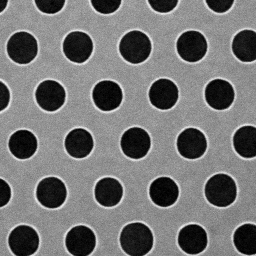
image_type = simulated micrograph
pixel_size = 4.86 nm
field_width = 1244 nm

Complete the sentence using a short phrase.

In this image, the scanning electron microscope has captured a regular array of holes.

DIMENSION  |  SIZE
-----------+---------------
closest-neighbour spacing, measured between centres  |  55.2 px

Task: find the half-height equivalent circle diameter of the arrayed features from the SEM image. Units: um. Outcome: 0.151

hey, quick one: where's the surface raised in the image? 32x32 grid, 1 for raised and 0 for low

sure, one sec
01110000111000011110001111000111
11111001111100111111011111101111
11111111111111111111111111111111
11111111111111111111111111111111
11001111000111110011110001111000
10000111000011100001110000111000
10000111000111100001110000111000
11001111100111110011111001111100
11111111111111111111111111111111
11111111111111111111111111111111
11111000111100011110001111000111
01110000111100011110001111000111
01110000111100011110001111000111
01111001111100011111011111101111
11111111111111111111111111111111
11111111111111111111111111111111
11001111100111110011111001111000
10000111000011100001110000111000
10000111000011100001110000111000
11001111100111110011111001111100
11111111111111111111111111111111
11111111111111111111111111111111
11111000111110011110001111000111
01111000111100011110001111000011
01111000111100011110001111000011
01111000111100011110001111000111
11111111111111111111111111111111
11111111111111111111111111111111
11001111100111100001111001111100
10000111000011100001110000111000
10000111000011100001110000111000
11001111100011110001111001111100